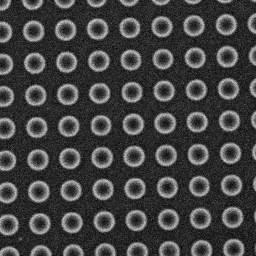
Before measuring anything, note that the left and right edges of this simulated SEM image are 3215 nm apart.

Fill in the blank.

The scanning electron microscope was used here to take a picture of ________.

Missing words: an array of small figures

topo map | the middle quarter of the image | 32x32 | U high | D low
UUUDDDUUUUUDDDDUUUUDDDDUUUDDDDDD
UUDDDDDDUUDDDDDDDDDDDDDDDDDDDDDD
DDDDDDDDDDDDDDDDDDDDDDDDDDDDDDDD
DDDDDDDDDDDDDDDDDDDDDDDDDDDDDDDD
DDDDDDDDDDDDDDDDDDDDDDDDUUDDDDDD
UUUDDDDUUUUDDDDUUUUDDDDUUUUDDDDU
UUUDDDUUUUUDDDDUUUUDDDDUUUUUDDDU
UUUDDDUUUUUDDDDUUUUDDDDUUUUDDDDU
UUUDDDDUUUUDDDDUUUUDDDDUUUUDDDDD
UUUDDDDDUUDDDDDDDDDDDDDDDDDDDDDD
DDDDDDDDDDDDDDDDDDDDDDDDDDDDDDDD
DDDDDDDDDDDDDDDDDDDDDDDDDDDDDDDD
DDDDDDDDDDDDDDDDDDDDDDDDUUDDDDDD
UUUDDDDDUUUDDDDUUUUDDDDUUUUUDDDU
UUUDDDDUUUUUDDDUUUUUDDDUUUUUDDDU
UUUUDDDUUUUUDDDUUUUUDDDUUUUUDDDU
UUUUDDDUUUUDDDDUUUUDDDDUUUUDDDDD
UUUDDDDDUUDDDDDDDUDDDDDDDDDDDDDD
DDDDDDDDDDDDDDDDDDDDDDDDDDDDDDDD
DDDDDDDDDDDDDDDDDDDDDDDDDDDDDDDD
DDDDDDDDDDDDDDDDDDDDDDDDDUUDDDDD
UUUDDDDDUUUDDDDDUUUDDDDUUUUUDDDU
UUUUDDDUUUUUDDDUUUUUDDDUUUUUDDDU
UUUUDDDUUUUUDDDUUUUUDDDUUUUUDDDU
UUUUDDDUUUUUDDDUUUUUDDDDUUUDDDDD
UUUDDDDDUUUDDDDDDUDDDDDDDDDDDDDD
DDDDDDDDDDDDDDDDDDDDDDDDDDDDDDDD
DDDDDDDDDDDDDDDDDDDDDDDDDDDDDDDD
DDDDDDDDDDDDDDDDDDDDDDDDDUUDDDDD
DUUDDDDDUUUDDDDDUUUUDDDDUUUUDDDD
UUUUDDDUUUUUDDDUUUUUDDDUUUUUDDDU
UUUUDDDUUUUUDDDUUUUUDDDUUUUUDDDD